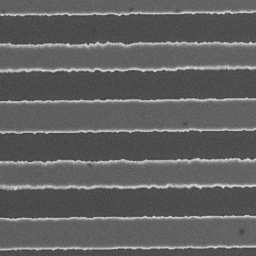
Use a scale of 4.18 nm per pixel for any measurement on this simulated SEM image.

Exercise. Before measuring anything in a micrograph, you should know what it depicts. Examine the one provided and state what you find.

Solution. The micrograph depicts lines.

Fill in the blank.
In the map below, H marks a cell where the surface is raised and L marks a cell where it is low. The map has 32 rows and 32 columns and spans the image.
HHHHHHHHHHHHHHHHHHHHHHHHHHHHHHHH
HHHHHHHHHHHHHHHHHHHHHHHHHHHHHHHH
LLLLLLLLLLLLLLLLLLLLLLLLLLLLLLLL
LLLLLLLLLLLLLLLLLLLLLLLLLLLLLLLL
LLLLLLLLLLLLLLLLLLLLLLLLLLLLLLLL
LLLLLLLLLLLLHHLLLHHHHHHHHHHHHHHH
HHHHHHHHHHHHHHHHHHHHHHHHHHHHHHHH
HHHHHHHHHHHHHHHHHHHHHHHHHHHHHHHH
HHHHHHHHHHHHHHHHHHHHHHHHHHHHLHLH
LLLLLLLLLLLLLLLLLLLLLLLLLLLLLLLL
LLLLLLLLLLLLLLLLLLLLLLLLLLLLLLLL
LLLLLLLLLLLLLLLLLLLLLLLLLLLLLLLL
LLLLLLLLLLHLHHHHHHLHHHHHHHHHHHHH
HHHHHHHHHHHHHHHHHHHHHHHHHHHHHHHH
HHHHHHHHHHHHHHHHHHHHHHHHHHHHHHHH
HHHHHHHHHHHHHHHHHHHHHHHHHHHHHHHH
HHHHHHHHHHHHHLHLHLLLLLLLLLLLLLLL
LLLLLLLLLLLLLLLLLLLLLLLLLLLLLLLL
LLLLLLLLLLLLLLLLLLLLLLLLLLLLLLLL
LLLLLLLLLLLLLLLLLLLLLLLLLLLLLLLL
HHHHHHHHHHHHHHHHHHHHHHHHHHHHHHHH
HHHHHHHHHHHHHHHHHHHHHHHHHHHHHHHH
HHHHHHHHHHHHHHHHHHHHHHHHHHHHHHHH
HHHLHLHHLHHHLLLHHLLLLLLLLLLLLLLL
LLLLLLLLLLLLLLLLLLLLLLLLLLLLLLLL
LLLLLLLLLLLLLLLLLLLLLLLLLLLLLLLL
LLLLLLLLLLLLLLLLLLLLLLLLLLLLLLLL
HHHHHHHHHHHHHHHHHHHHHHHHHHHHHHHH
HHHHHHHHHHHHHHHHHHHHHHHHHHHHHHHH
HHHHHHHHHHHHHHHHHHHHHHHHHHHHHHHH
HHHHHHHHHHHHHHHHHHHHHHHHHHHHHHHH
LLLLLLLLLLLLLLLLLLLLLLLLLLLLLLLL